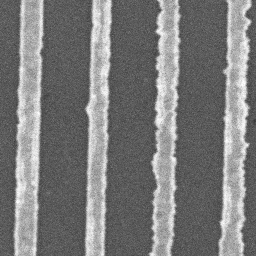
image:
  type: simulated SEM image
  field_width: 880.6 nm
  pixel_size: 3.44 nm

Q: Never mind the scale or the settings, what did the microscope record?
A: one or a few lines or trenches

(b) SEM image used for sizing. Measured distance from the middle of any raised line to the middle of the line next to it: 236 nanometers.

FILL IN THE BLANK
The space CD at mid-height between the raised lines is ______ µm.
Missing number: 0.177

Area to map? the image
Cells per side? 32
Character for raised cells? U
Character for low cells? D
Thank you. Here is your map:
DDDUUDDDDDDDUUDDDDDDUUDDDDDDDUUD
DDDUUDDDDDDDUUDDDDDDUUDDDDDDDUUD
DDDUUDDDDDDDUUDDDDDDUUDDDDDDDUUD
DDDUUDDDDDDDUUDDDDDDUUDDDDDDDUUD
DDDUUDDDDDDDUDDDDDDDUUDDDDDDDUUD
DDDUUDDDDDDDUUDDDDDDUUDDDDDDDUUD
DDDUUDDDDDDDUUDDDDDDUUDDDDDDDUUD
DDDUUDDDDDDDUDDDDDDDUUDDDDDDDUUD
DDDUUDDDDDDDUUDDDDDDUUDDDDDDDUUD
DDDUUDDDDDDDUDDDDDDDUUDDDDDDDUUD
DDDUUDDDDDDDUDDDDDDDUUDDDDDDUUUD
DDDUUDDDDDDUUDDDDDDDUUDDDDDDUUDD
DDDUUDDDDDDUUDDDDDDDUUDDDDDDUUUD
DDUUUDDDDDDUUDDDDDDDUUDDDDDDUUUD
DDUUUDDDDDDUUDDDDDDDUUDDDDDDUUUD
DDDUUDDDDDDUUDDDDDDDUUDDDDDDUUUD
DDUUUDDDDDDUUDDDDDDDUUDDDDDDUUDD
DDUUUDDDDDDUUDDDDDDDUUDDDDDDUUDD
DDUUUDDDDDDUUDDDDDDDUUDDDDDDUUUD
DDUUUDDDDDDUUDDDDDDDUUDDDDDDUUDD
DDUUUDDDDDDUUDDDDDDUUUDDDDDDUUDD
DDUUUDDDDDDUUDDDDDDUUUDDDDDDUUDD
DDUUUDDDDDDUUDDDDDDDUUDDDDDDUUDD
DDUUUDDDDDDUUDDDDDDDUUDDDDDDUUDD
DDUUDDDDDDDUUDDDDDDDUUDDDDDDUUDD
DDUUUDDDDDDUUDDDDDDUUUDDDDDDUUDD
DDUUUDDDDDDUUDDDDDDUUUDDDDDDUUDD
DDUUDDDDDDDUUDDDDDDUUDDDDDDDUUDD
DDUUDDDDDDDUUDDDDDDUUDDDDDDDUUDD
DDUUDDDDDDDUUDDDDDDUUUDDDDDDUUDD
DDUUDDDDDDDUUDDDDDDUUDDDDDDDUUDD
DDUUDDDDDDDUUDDDDDDUUDDDDDDDUUDD